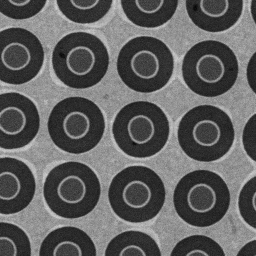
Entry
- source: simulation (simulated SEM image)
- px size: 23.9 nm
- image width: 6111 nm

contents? an array of small figures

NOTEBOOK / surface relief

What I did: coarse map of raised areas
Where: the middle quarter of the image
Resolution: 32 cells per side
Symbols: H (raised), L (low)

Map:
LHHHHHHLLLLHHLLLLHHHHHHLLLLLLLLL
LLHHHHLLLLLHHLLLLHHHHHHLLLLLLLLL
LLLLLLLLLLLHHHLLLLHHHHHLLLLLHLLL
LLLLLLLLLLHHHHLLLLLLLLLLLLLHHLLL
LLLLLLLLLHHHHHHLLLLLLLLLLLLHHHLL
HLLLLLLHHHHHHHHHLLLLLLLLLLHHHHHL
HHHHHHHHHHHHHHHHHLLLLLLLHHHHHHHH
HHHHHHHHHHHHHHHHHHHHHHHHHHHHHHHH
HLLLLHHHHHHHHHHHHHHHHHHHHHHHHHHH
LLLLLLLHHHHHHHHHHLLLLLHHHHHHHHHH
LLLLLLLLHHHHHHHLLLLLLLLLHHHHHHHH
LLLLLLLLLHHHHHLLLLLLLLLLLHHHHHHL
LLHHHLLLLLHHHLLLLLLLLLLLLLHHHHLL
LHHHHHLLLLHHLLLLLLHHLLLLLLHHHLLL
HHHHHHLLLLLHLLLLLHHHHHLLLLLHLLLL
HHHHHHLLLLLHLLLLHHHHHHLLLLLHLLLL
HHHHHHLLLLHHLLLLHHHHHHLLLLLHLLLL
LHHHHLLLLLHHLLLLLHHHHHLLLLLHLLLL
LLLLLLLLLHHHLLLLLHHHHLLLLLHHLLLL
LLLLLLLLLHHHLLLLLLHHLLLLLLHHHLLL
LLLLLLLLHHHHHLLLLLLLLLLLLHHHHLLL
LLLLLLLHHHHHHHLLLLLLLLLLLHHHHHLL
HHLHHHHHHHHHHHHLLLLLLLLHHHHHHHLL
HHHHHHHHHHHHHHHHHLLLLHHHHHHHHHHL
LLLLHHHHHHHHHHHHHHHHHHHHHHHHHHHH
LLLLLLHHHHHHHHHHLLLLHHHHHHHHHHHH
LLLLLLLHHHHHHHLLLLLLLLHHHHHHHHHH
LLLLLLLLHHHHHLLLLLLLLLLHHHHHHHHL
LHHLLLLLLHHHLLLLLLLLLLLLHHHHHLLL
HHHHLLLLLHHHLLLLLLLLLLLLLHHHHLLL
HHHHHLLLLHHLLLLLHHHHLLLLLHHHLLLL
HHHHHLLLLHHLLLLHHHHHHLLLLHHHLLLL